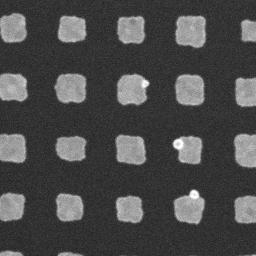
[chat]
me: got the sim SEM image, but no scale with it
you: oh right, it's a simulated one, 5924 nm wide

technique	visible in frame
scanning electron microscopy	a regular array of raised bodies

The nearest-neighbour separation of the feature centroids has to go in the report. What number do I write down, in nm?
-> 1370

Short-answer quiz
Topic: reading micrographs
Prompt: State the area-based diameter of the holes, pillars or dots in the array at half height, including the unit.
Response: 663 nm